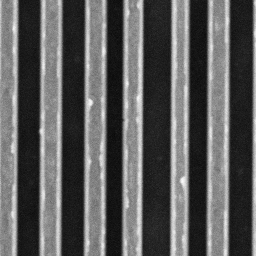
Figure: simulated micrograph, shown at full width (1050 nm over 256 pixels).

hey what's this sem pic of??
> parallel lines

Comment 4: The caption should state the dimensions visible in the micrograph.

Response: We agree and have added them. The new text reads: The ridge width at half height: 0.0804 micrometres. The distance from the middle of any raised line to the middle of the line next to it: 172 nm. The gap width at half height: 101 nm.